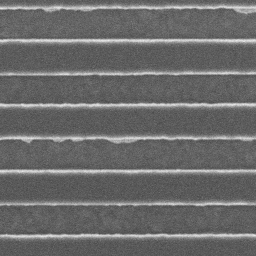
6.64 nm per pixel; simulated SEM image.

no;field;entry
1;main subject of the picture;lines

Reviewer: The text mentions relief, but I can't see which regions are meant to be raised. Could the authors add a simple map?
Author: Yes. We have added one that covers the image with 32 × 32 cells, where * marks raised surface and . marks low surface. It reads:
********************************
................................
................................
................................
................................
********************************
********************************
********************************
********************************
................................
................................
................................
................................
********************************
********************************
********************************
********************************
................................
................................
................................
................................
********************************
********************************
********************************
********************************
********************************
................................
................................
................................
***.****************************
********************************
********************************